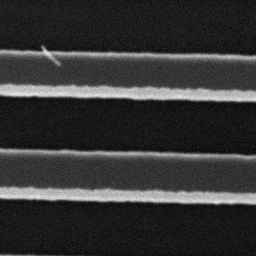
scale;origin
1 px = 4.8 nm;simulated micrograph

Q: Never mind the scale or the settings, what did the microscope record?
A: lines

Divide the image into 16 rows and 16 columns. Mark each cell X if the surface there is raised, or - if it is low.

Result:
----------------
----------------
----------------
XXXXXXXXXXX-X---
XXXXXXXXXXXXXXXX
XXXXXXXXXXXXXXXX
----------------
----------------
----------------
XXX-X-----------
XXXXXXXXXXXXXXXX
XXXXXXXXXXXXXXXX
-----XXXXXXXXXXX
----------------
----------------
----------------